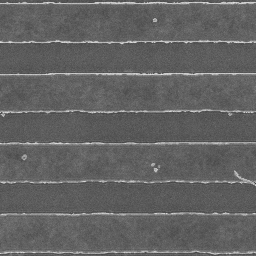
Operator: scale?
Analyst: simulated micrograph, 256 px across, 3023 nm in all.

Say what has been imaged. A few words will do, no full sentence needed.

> lines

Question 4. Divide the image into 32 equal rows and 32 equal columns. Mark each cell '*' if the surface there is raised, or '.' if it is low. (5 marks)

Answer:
********************************
********************************
********************************
********************************
********************************
................................
................................
................................
................................
********************************
********************************
********************************
********************************
********************************
................................
................................
................................
................................
********************************
********************************
********************************
********************************
********************************
................................
................................
................................
................................
********************************
********************************
********************************
********************************
***...**.*****.**.....*..*******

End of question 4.